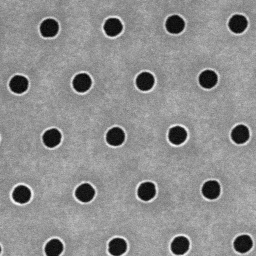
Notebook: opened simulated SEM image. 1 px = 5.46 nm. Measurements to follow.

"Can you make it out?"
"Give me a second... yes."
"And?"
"a regular array of holes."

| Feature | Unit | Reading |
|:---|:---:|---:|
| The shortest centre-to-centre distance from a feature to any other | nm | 342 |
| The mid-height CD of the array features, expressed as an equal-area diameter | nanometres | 111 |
